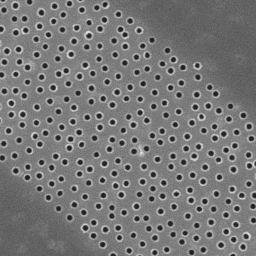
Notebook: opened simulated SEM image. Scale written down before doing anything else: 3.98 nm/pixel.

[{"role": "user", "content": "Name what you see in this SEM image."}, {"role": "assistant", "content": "a regular array of holes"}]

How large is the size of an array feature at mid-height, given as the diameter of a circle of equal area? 22 nanometers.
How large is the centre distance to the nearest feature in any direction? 46.2 nm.